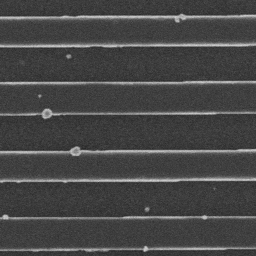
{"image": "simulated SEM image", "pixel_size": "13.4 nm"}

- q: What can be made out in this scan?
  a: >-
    lines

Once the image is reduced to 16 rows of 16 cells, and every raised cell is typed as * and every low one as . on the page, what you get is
................
****************
****************
................
................
****************
****************
................
................
****************
****************
................
................
................
****************
****************